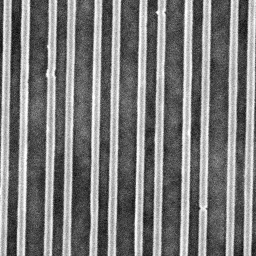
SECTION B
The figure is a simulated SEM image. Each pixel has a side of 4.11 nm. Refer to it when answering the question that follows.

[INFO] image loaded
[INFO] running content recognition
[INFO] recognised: parallel lines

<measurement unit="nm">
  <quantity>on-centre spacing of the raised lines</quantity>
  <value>91.9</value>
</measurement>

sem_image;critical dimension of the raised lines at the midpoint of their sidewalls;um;0.0292